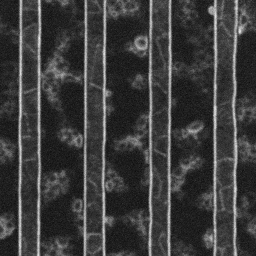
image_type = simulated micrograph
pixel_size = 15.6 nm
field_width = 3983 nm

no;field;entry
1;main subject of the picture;one or a few lines or trenches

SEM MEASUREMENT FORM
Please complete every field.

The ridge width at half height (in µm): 0.298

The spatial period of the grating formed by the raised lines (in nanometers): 1010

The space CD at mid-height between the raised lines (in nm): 712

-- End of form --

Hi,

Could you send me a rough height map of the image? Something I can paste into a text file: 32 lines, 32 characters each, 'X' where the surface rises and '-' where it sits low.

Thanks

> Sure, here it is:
---XX------XX------XX------XXX--
---XX------XX------XX------XXX--
---XX------XX------XX------XXXX-
---XX------XX------XX------XXX--
---XX------XX------XX------XXX--
---XX------XX----XXXX------XX---
---XX------XX------XX------XX---
---XX------XX------XX------XX---
---XX------XX------XX------XX---
---XX---X--XX------XX------XX---
---XX------XX------XX------XX---
---XX------XX------XX------XX---
---XX------XX------XX------XX---
---XX------XX------XX------XX---
---XX------XX------XX------XX---
---XX------XX------XX---X--XX---
---XX------XX------XX------XX---
---XX-----XXX------XX------XX---
---XX------XX------XX------XX---
---XX------XX------XX------XX---
---XX------XX------XX------XX---
---XX------XX------XX------XX---
--XXX------XX------XX------XX---
--XXX------XX------XX------XX---
--XXX------XX------XX------XX---
--XXX----X-XX------XX------XX---
---XX------XX------XX------XX---
---XX------XX------XX------XX---
---XX------XX------XX------XX---
---XX------XX------XX------XX---
---XX------XX------XX------XX---
---XX------XX------XX------XX---